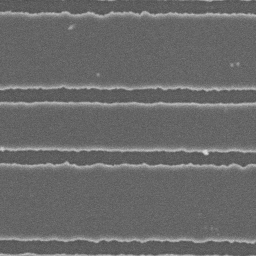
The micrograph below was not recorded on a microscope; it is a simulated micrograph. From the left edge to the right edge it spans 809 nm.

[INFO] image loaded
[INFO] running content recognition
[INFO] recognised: lines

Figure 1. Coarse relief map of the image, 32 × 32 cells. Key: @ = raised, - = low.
--------------------------------
@@-------------@----------------
@@@@@@@@@@@@@@@@@@@@@@@@@@@@@@@@
@@@@@@@@@@@@@@@@@@@@@@@@@@@@@@@@
@@@@@@@@@@@@@@@@@@@@@@@@@@@@@@@@
@@@@@@@@@@@@@@@@@@@@@@@@@@@@@@@@
@@@@@@@@@@@@@@@@@@@@@@@@@@@@@@@@
@@@@@@@@@@@@@@@@@@@@@@@@@@@@@@@@
@@@@@@@@@@@@@@@@@@@@@@@@@@@@@@@@
@@@@@@@@@@@@@@@@@@@@@@@@@@@@@@@@
@@@@@@@@@@@@@@@@@@@@@@@@@@@@@@@@
--------------------------------
--------------------------------
@@@@@@@@@@@@@@@@@@@@@@@@@@@@@@@@
@@@@@@@@@@@@@@@@@@@@@@@@@@@@@@@@
@@@@@@@@@@@@@@@@@@@@@@@@@@@@@@@@
@@@@@@@@@@@@@@@@@@@@@@@@@@@@@@@@
@@@@@@@@@@@@@@@@@@@@@@@@@@@@@@@@
@@@@@@@@@@@@@@@@@@@@@@@@@@@@@@@@
--------------------------------
@@-----@@---@--@-------@--------
@@@@@@@@@@@@@@@@@@@@@@@@@@@@@@@@
@@@@@@@@@@@@@@@@@@@@@@@@@@@@@@@@
@@@@@@@@@@@@@@@@@@@@@@@@@@@@@@@@
@@@@@@@@@@@@@@@@@@@@@@@@@@@@@@@@
@@@@@@@@@@@@@@@@@@@@@@@@@@@@@@@@
@@@@@@@@@@@@@@@@@@@@@@@@@@@@@@@@
@@@@@@@@@@@@@@@@@@@@@@@@@@@@@@@@
@@@@@@@@@@@@@@@@@@@@@@@@@@@@@@@@
@@@@@@@@@@@@@@@@@@@@@@@@@@@@@@@@
--------------------------------
--------------------------------